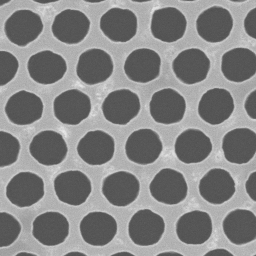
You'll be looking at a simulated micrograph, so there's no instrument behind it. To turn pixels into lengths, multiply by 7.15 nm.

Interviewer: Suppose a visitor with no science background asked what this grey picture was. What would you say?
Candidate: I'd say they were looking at a regular array of holes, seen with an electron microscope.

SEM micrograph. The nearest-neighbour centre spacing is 0.332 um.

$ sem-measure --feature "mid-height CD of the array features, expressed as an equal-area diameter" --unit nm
257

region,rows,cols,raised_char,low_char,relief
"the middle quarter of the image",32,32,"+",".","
.++.........+++.........+++.....
.++.........+++.........+++.....
+++.........+++.........++++....
++++.......+++++.......++++++...
+++++....+++++++++...+++++++++..
++++++++++++++++++++++++++++++++
+..++++++++++...++++++++....++++
.....++++++.......++++.......+++
......++++.........+++........++
.......+++.........+++........++
.......+++.........++.........++
.......+++.........++.........++
......++++........++++........++
......++++.......+++++........++
....++++++++....+++++++.....++++
++++++++++++++++++++++++++++++++
++++++++.++++++++++...+++++++++.
++++++.....++++++......++++++...
+++++.......++++........++++....
++++.........+++........++++....
.++..........++..........+++....
.++..........++.........++++....
.+++........++++........++++....
++++........++++........+++++...
+++++......++++++.....++++++++..
++++++++++++++++++++++++++++++++
++++++++++++++++++++++++....++++
.....+++++++.....++++++......+++
......++++........++++........++
.......+++.........+++........++
.......+++.........++..........+
.......+++.........++..........+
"